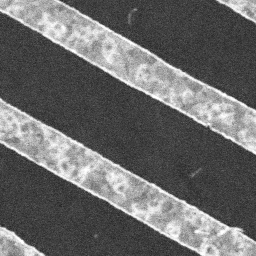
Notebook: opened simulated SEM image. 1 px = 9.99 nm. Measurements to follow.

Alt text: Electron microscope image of one or a few lines or trenches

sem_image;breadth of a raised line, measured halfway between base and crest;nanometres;366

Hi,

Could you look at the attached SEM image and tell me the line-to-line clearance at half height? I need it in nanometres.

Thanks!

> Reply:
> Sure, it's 777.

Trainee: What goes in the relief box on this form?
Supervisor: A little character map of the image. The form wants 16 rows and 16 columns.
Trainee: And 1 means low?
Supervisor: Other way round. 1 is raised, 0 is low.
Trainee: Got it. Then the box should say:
1111000000000001
0011110000000000
0001111100000000
0000011111000000
0000000111100000
0000000001111000
0000000000111110
1100000000001111
1111000000000011
0111110000000000
0001111100000000
0000011110000000
0000000111100000
0000000011111000
1000000000111110
1100000000001111